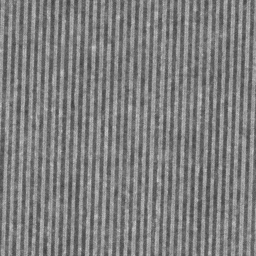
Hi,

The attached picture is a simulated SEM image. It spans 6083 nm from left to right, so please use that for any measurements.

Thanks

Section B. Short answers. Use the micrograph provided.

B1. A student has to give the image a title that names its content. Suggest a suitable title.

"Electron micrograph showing parallel lines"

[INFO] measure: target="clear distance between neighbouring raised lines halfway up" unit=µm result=0.113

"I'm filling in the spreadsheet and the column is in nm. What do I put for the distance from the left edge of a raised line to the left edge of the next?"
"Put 182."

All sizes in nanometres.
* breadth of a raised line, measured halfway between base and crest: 74.2